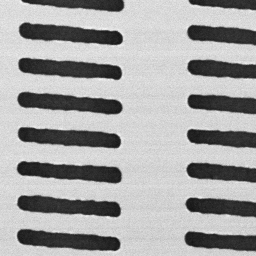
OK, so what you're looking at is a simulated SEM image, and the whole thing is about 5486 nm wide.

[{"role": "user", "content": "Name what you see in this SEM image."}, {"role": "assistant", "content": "holes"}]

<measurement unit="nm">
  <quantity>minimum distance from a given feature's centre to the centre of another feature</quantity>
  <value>733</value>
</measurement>